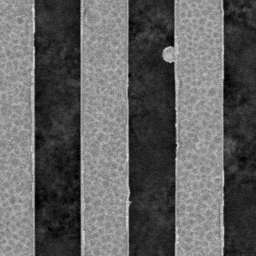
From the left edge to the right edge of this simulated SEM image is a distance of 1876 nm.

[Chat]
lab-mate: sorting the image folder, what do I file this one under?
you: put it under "one or a few lines or trenches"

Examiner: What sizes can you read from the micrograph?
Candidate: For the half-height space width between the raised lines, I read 350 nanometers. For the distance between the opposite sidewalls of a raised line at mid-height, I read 344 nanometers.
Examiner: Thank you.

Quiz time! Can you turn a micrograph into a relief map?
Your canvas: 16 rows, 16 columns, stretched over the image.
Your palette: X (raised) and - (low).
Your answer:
XX---XXX---XXX--
XX---XXX---XXX--
XX---XXX---XXX--
XX---XXX---XXX--
XX---XXX---XXX--
XX---XXX---XXX--
XX---XXX---XXX--
XX---XXX---XXX--
XX---XXX---XXX--
XX---XXX---XXX--
XX---XXX---XXX--
XX---XXX---XXX--
XX---XXX---XXX--
XX---XXX---XXX--
XX---XXX---XXX--
XX---XXX---XXX--